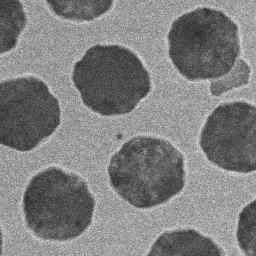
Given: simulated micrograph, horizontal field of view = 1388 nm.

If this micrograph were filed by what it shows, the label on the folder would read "holes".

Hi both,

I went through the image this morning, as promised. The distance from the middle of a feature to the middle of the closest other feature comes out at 526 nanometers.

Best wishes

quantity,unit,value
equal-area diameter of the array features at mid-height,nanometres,395